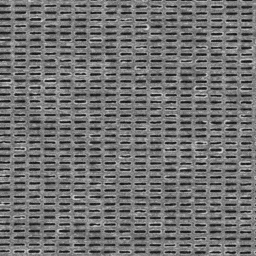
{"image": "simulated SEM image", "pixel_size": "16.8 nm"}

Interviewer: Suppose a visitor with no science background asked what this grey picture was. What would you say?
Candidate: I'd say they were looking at a regular array of holes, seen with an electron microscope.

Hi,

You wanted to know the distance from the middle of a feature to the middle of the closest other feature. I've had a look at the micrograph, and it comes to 111 nm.